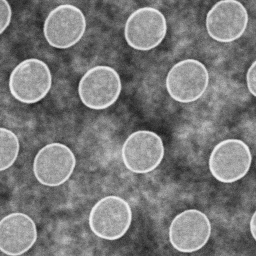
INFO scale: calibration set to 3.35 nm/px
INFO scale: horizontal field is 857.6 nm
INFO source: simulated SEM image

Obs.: a regular array of raised bodies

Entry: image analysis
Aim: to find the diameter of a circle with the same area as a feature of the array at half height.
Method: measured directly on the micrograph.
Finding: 41.3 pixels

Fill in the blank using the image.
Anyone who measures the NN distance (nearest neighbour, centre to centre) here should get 240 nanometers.